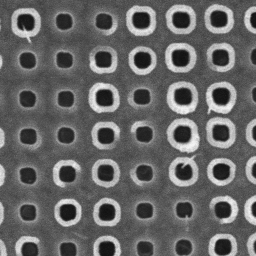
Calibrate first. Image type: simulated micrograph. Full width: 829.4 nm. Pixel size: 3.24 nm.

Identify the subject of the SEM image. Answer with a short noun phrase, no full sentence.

a regular array of holes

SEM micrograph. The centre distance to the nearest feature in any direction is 121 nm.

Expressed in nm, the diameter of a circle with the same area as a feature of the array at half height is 58.4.